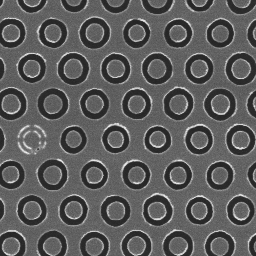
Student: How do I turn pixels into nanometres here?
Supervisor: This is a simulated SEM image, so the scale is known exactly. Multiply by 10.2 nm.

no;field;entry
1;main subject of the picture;a regular array of ring-shaped grooves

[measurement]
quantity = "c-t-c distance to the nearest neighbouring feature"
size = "40.7 pixels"